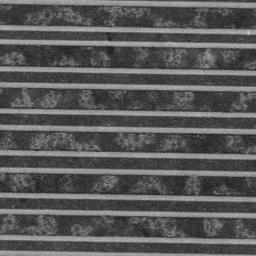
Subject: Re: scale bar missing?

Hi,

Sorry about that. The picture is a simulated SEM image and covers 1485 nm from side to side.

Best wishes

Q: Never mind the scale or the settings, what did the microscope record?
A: parallel lines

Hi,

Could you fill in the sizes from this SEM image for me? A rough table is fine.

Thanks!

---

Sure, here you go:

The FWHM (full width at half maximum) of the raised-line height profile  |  90 nanometres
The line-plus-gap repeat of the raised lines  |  244 nm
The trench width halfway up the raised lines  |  154 nanometres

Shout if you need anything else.